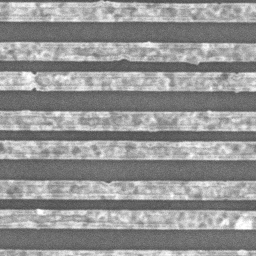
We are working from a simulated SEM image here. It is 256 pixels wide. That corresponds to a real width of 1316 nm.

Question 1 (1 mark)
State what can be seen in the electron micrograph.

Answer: parallel lines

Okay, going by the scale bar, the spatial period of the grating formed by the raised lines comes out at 34.5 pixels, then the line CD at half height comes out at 90.5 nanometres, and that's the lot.